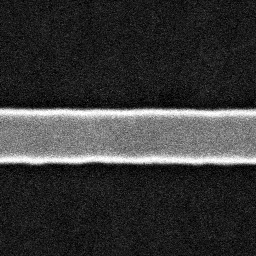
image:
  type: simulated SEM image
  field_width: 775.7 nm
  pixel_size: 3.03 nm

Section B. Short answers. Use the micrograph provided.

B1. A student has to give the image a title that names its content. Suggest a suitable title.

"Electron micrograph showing one or a few lines or trenches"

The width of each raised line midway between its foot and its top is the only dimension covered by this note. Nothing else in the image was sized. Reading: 148 nm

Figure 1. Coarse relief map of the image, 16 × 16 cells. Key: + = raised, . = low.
................
................
................
................
................
................
................
++++++++++++++++
++++++++++++++++
++++++++++++++++
................
................
................
................
................
................